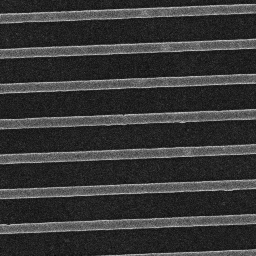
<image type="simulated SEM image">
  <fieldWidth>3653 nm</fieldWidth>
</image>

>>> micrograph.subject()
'parallel lines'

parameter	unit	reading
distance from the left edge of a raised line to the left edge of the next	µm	0.5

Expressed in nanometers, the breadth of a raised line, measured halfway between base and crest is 134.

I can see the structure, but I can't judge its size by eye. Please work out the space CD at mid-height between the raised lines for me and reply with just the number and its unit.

364 nm